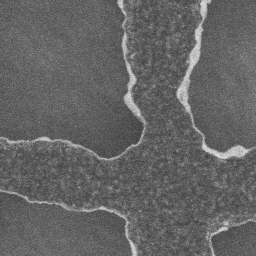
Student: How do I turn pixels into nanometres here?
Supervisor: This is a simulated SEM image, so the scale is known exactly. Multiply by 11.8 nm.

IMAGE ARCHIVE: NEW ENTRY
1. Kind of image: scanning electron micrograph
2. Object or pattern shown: holes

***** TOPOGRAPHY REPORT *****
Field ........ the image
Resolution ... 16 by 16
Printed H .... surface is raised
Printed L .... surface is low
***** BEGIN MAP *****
LLLLLLLLHHHHHLLL
LLLLLLLLHHHHHLLL
LLLLLLLLHHHHLLLL
LLLLLLLLHHHHLLLL
LLLLLLLLHHHHLLLL
LLLLLLLLHHHLLLLL
LLLLLLLLHHHHLLLL
LLLLLLLLLHHHLLLL
LLLLLLLLLHHHHLLL
HHHHHHLLHHHHHHHH
HHHHHHHHHHHHHHHH
HHHHHHHHHHHHHHHH
LLHHHHHHHHHHHHHH
LLLLLLLHHHHHHHHH
LLLLLLLLHHHHHHLL
LLLLLLLLHHHHHLLL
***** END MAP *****